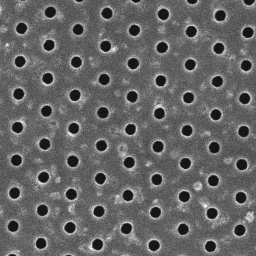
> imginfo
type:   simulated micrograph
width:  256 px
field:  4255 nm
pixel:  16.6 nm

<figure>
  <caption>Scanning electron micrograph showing a regular array of holes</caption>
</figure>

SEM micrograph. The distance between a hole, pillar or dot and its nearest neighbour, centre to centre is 536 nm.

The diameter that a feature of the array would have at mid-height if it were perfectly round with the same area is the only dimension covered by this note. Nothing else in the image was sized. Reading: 188 nm